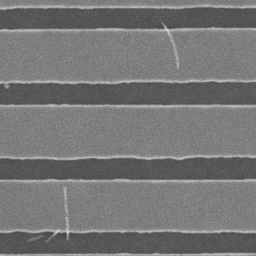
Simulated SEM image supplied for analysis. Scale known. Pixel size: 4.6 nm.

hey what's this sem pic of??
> lines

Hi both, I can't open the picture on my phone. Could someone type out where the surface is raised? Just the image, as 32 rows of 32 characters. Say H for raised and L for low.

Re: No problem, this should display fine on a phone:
HHHHHHHHHHHHHHHHHHHHHHHHHHHHHHHH
LLLLLLLLLLLLLLLLLLLLLLLLLLLLLLLL
LLLLLLLLLLLLLLLLLLLLLLLLLLLLLLLL
LLLLLLLLLLLLLLLLLLLLLLLLLLHLLLLL
HHHHHHHHHHHHHHHHHHHHHHHHHHHHHHHH
HHHHHHHHHHHHHHHHHHHHHHHHHHHHHHHH
HHHHHHHHHHHHHHHHHHHHHHHHHHHHHHHH
HHHHHHHHHHHHHHHHHHHHHHHHHHHHHHHH
HHHHHHHHHHHHHHHHHHHHHHHHHHHHHHHH
HHHHHHHHHHHHHHHHHHHHHHHHHHHHHHHH
LLLLLLLLLLLLLLLLLLLLLLLLLLLLLLLL
LLLLLLLLLLLLLLLLLLLLLLLLLLLLLLLL
LLLLLLLLLLLLLLLLLLLLLLLLLLLLLLLL
HHHHHHHHHHHHHHHHHHHHHHHHHHHHHHHH
HHHHHHHHHHHHHHHHHHHHHHHHHHHHHHHH
HHHHHHHHHHHHHHHHHHHHHHHHHHHHHHHH
HHHHHHHHHHHHHHHHHHHHHHHHHHHHHHHH
HHHHHHHHHHHHHHHHHHHHHHHHHHHHHHHH
HHHHHHHHHHHHHHHHHHHHHHHHHHHHHHHH
HHHHHHHHHHHHHHHHHHHHHHHHHHHHHHHH
LLLLLLLLLLLLLLLLLLLLLLLLLLLLLLLL
LLLLLLLLLLLLLLLLLLLLLLLLLLLLLLLL
LLLLLHHLHHLLLLHHLLLLLLLLLLLLLLHH
HHHHHHHHHHHHHHHHHHHHHHHHHHHHHHHH
HHHHHHHHHHHHHHHHHHHHHHHHHHHHHHHH
HHHHHHHHHHHHHHHHHHHHHHHHHHHHHHHH
HHHHHHHHHHHHHHHHHHHHHHHHHHHHHHHH
HHHHHHHHHHHHHHHHHHHHHHHHHHHHHHHH
HHHHHHHHHHHHHHHHHHHHHHHHHHHHHHHH
LLLLLLLLLLLLLLLLLLLLLLLLLLLLLLLL
LLLLLLLLLLLLLLLLLLLLLLLLLLLLLLLL
LLLLLLLLLLLLLLLLLLLLLLLLLLLLLLLL